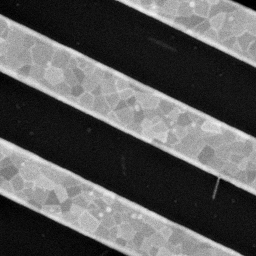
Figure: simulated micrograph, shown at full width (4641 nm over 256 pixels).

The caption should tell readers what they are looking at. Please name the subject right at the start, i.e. lines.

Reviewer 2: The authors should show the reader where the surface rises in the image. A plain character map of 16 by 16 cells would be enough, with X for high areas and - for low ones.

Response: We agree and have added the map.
--------XXXXXXX-
X----------XXXXX
XXX----------XXX
XXXXX----------X
XXXXXXX---------
--XXXXXXX-------
----XXXXXXXX----
------XXXXXXXX--
--------XXXXXXXX
XX--------XXXXXX
XXXX---------XXX
XXXXXX---------X
-XXXXXXX--------
---XXXXXXX------
-----XXXXXXX----
-------XXXXXXX--